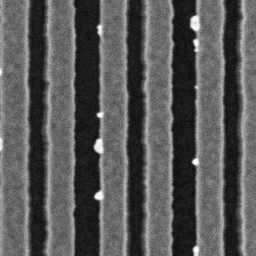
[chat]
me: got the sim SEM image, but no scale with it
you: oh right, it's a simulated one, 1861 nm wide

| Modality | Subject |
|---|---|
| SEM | lines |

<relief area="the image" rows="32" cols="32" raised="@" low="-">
@@@@--@@@----@@@--@@@----@@@--@@
@@@@--@@@----@@@--@@@@---@@@--@@
@@@@--@@@----@@@--@@@---@@@@--@@
@@@---@@@---@@@@--@@@@--@@@@--@@
@@@---@@@---@@@@--@@@----@@@--@@
@@@---@@@----@@@--@@@@--@@@@--@@
@@@@--@@@----@@@--@@@---@@@@--@@
@@@@--@@@----@@@--@@@----@@@--@@
@@@@--@@@----@@@--@@@----@@@--@@
@@@---@@@----@@@--@@@----@@@--@@
@@@@--@@@----@@@--@@@----@@@--@@
@@@@--@@@----@@@--@@@----@@@--@@
@@@@--@@@----@@@--@@@----@@@--@@
@@@@--@@@----@@@--@@@----@@@--@@
@@@@--@@@---@@@@--@@@----@@@--@@
@@@@--@@@----@@@--@@@----@@@--@@
@@@@--@@@----@@@--@@@----@@@--@@
@@@@--@@@---@@@@--@@@----@@@--@@
@@@@--@@@---@@@@--@@@@---@@@--@@
@@@@--@@@----@@@--@@@----@@@--@@
@@@---@@@----@@@--@@@---@@@@--@@
@@@---@@@----@@@--@@@----@@@--@@
@@@@--@@@----@@@--@@@----@@@--@@
@@@@--@@@----@@@--@@@----@@@--@@
@@@@--@@@---@@@@--@@@----@@@--@@
@@@@--@@@----@@@--@@@----@@@--@@
@@@@--@@@----@@@--@@@----@@@--@@
@@@@--@@@----@@@--@@@----@@@--@@
@@@@--@@@----@@@--@@@----@@@--@@
@@@@--@@@----@@@--@@@----@@@--@@
@@@@--@@@----@@@--@@@----@@@--@@
@@@@--@@@----@@@--@@@---@@@@--@@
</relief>